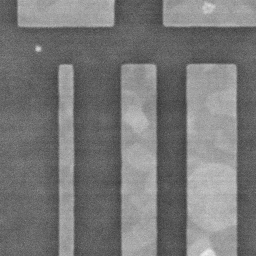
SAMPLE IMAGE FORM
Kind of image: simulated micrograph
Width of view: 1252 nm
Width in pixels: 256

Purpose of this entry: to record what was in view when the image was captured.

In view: groups of lines, slits or small figures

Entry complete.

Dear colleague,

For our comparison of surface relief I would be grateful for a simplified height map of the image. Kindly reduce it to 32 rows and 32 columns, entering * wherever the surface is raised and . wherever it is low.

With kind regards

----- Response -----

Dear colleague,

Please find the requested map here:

..************......************
..************......************
..************......************
................................
................................
................................
................................
................................
.......**......*****...******...
.......**......*****...******...
.......**......*****...******...
.......**......*****...******...
.......**......*****...******...
.......**......*****...******...
.......**......*****...******...
.......**......*****...******...
.......**......*****...******...
.......**......*****...******...
.......**......*****...******...
.......**......*****...******...
.......**......*****...******...
.......**......*****...******...
.......**......*****...******...
.......**......*****...******...
.......**......*****...******...
.......**......*****...******...
.......**......*****...******...
.......**......*****...******...
.......**......*****...******...
.......**......*****...******...
.......**......*****...******...
.......**......*****...******...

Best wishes